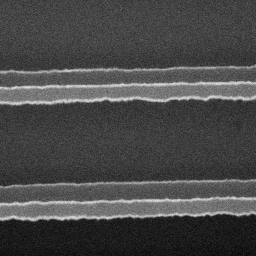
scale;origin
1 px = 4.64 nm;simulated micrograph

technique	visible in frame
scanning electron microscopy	lines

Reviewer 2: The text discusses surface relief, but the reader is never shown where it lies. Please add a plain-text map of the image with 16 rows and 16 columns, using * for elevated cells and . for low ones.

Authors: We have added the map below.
................
................
................
................
****************
****************
................
................
................
................
................
.....***********
****************
**********......
................
................